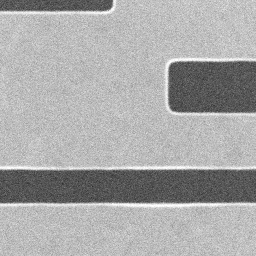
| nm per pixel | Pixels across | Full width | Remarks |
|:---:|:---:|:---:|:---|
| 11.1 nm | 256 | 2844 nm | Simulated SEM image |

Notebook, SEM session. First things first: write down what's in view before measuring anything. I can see groups of lines, slits or small figures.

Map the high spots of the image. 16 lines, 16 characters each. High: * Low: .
.......*********
****************
****************
****************
**********......
**********......
***********.....
****************
****************
****************
.*********..****
................
................
****************
****************
****************